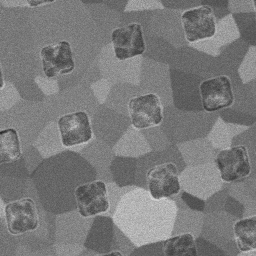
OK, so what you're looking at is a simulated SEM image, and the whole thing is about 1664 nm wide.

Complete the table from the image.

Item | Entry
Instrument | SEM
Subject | a regular array of holes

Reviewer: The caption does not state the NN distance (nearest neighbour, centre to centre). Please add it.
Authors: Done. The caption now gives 0.468 microns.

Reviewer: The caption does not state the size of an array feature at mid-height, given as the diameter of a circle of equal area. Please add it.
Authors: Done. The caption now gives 223 nanometres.